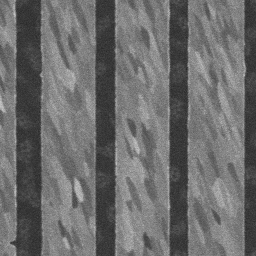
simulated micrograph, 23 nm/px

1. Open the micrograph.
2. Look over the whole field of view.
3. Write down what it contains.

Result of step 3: one or a few lines or trenches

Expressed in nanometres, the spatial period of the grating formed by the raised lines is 1700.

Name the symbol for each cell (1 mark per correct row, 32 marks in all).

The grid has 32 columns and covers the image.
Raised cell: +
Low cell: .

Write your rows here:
++...+++++++...++++++...++++++..
++...+++++++...++++++...++++++..
++...+++++++...++++++...++++++..
++...+++++++...++++++...++++++..
++...+++++++...++++++...++++++..
++...+++++++...++++++...++++++..
++...+++++++...++++++...++++++..
++...+++++++...++++++...++++++..
++...+++++++...++++++...+++++++.
++...+++++++...++++++...+++++++.
++...+++++++...++++++...++++++..
++...+++++++...++++++...++++++..
++...+++++++...++++++...++++++..
++...+++++++...++++++...++++++..
++...+++++++...++++++...++++++..
++...+++++++...++++++...++++++..
++...+++++++...++++++...++++++..
++...+++++++...++++++...++++++..
++...+++++++...++++++...++++++..
++...+++++++...++++++...++++++..
++...+++++++...++++++...++++++..
++...+++++++...++++++...++++++..
++...+++++++...++++++...++++++..
++...+++++++...++++++...++++++..
++...+++++++...++++++...++++++..
++...+++++++...++++++...++++++..
++...+++++++...++++++...++++++..
++...+++++++...++++++...++++++..
++...+++++++...++++++...++++++..
++...+++++++...++++++...++++++..
+....+++++++...++++++...++++++..
++...+++++++...++++++...++++++..